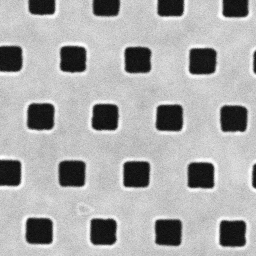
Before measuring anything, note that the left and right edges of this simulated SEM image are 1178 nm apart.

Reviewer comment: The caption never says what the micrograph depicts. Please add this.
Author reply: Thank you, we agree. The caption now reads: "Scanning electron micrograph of a regular array of holes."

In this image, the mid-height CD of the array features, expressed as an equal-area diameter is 139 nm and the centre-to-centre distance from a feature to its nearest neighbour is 297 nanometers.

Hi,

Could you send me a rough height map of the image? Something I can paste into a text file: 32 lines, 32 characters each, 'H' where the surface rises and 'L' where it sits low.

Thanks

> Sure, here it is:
HHHHLLLHHHHLLLLHHHHHLLLHHHHHLLLH
HHHHLLLHHHHHLLLHHHHHLLLHHHHHLLLH
HHHHHHHHHHHHHHHHHHHHHHHHHHHHHHHH
HHHHHHHHHHHHHHHHHHHHHHHHHHHHHHHH
HHHHHHHHHHHHHHHHHHHHHHHHHHHHHHHH
HHHHHHHHHHHHHHHHHHHHHHHHHHHHHHHH
LLLHHHHLLLLHHHHHLLLHHHHHLLLHHHHH
LLLHHHHLLLLHHHHLLLLHHHHHLLLHHHHH
LLLHHHHLLLLHHHHHLLLHHHHHLLLHHHHH
HHHHHHHHHHHHHHHHHHHHHHHHHHHHHHHH
HHHHHHHHHHHHHHHHHHHHHHHHHHHHHHHH
HHHHHHHHHHHHHHHHHHHHHHHHHHHHHHHH
HHHHHHHHHHHHHHHHHHHHHHHHHHHHHHHH
HHHLLLLHHHHHLLLHHHHHLLLHHHHHLLLH
HHHLLLLHHHHLLLLHHHHLLLLHHHHHLLLH
HHHLLLLHHHHLLLLHHHHLLLLHHHHLLLLH
HHHHHHHHHHHHHHHHHHHHHLHHHHHHLHHH
HHHHHHHHHHHHHHHHHHHHHHHHHHHHHHHH
HHHHHHHHHHHHHHHHHHHHHHHHHHHHHHHH
HHHHHHHHHHHHHHHHHHHHHHHHHHHHHHHH
LLLHHHHLLLLHHHHLLLLHHHHHLLHHHHHH
LLLHHHHLLLLHHHHLLLLHHHHLLLLHHHHH
LLLHHHHLLLLHHHHLLLLHHHHLLLLHHHHL
HHHHHHHHHHHHHHHHLLHHHHHHLLLHHHHH
HHHHHHHHHHHHHHHHHHHHHHHHHHHHHHHH
HHHHHHHHHHHHHHHHHHHHHHHHHHHHHHHH
HHHHHHHHHHHHHHHHHHHHHHHHHHHHHHHH
HHHLLLHHHHHHLLHHHHHHLLHHHHHHHHHH
HHHLLLLHHHHLLLLHHHHLLLLHHHHLLLLH
HHHLLLLHHHHLLLLHHHHLLLLHHHHLLLLH
HHHHLLHHHHHHLLHHHHHHLLLHHHHHLLLH
HHHHHHHHHHHHHHHHHHHHHHHHHHHHHHHH